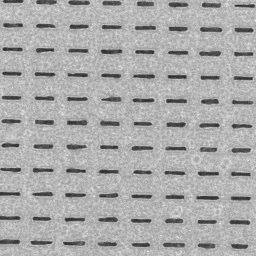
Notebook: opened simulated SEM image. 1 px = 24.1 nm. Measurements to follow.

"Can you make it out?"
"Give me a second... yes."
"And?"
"a regular array of holes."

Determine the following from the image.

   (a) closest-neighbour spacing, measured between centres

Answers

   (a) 575 nm